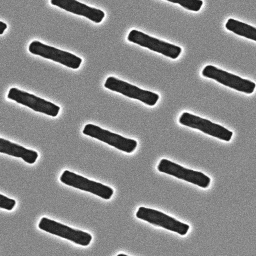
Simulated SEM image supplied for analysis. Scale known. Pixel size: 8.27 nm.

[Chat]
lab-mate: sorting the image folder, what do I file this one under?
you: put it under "a regular array of holes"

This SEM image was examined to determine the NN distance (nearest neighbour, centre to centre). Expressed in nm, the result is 426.